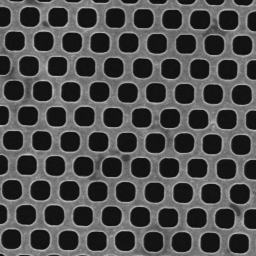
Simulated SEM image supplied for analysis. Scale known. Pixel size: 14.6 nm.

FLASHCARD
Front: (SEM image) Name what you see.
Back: a regular array of holes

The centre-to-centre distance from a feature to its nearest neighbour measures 0.411 micrometres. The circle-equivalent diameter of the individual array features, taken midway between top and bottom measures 306 nm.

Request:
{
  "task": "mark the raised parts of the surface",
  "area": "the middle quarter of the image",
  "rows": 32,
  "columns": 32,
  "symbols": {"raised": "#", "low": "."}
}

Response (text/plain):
.##.....##.....##.....##.....##.
.##.....##.....##.....##.....##.
###....###.....##.....##.....###
############.######..####...####
#.######..######################
....###....###....###....###....
....##......#......#.....###....
....##.....##......#......##....
....###....###....###....###....
#..#####.#####...#####..####....
################################
###....###....####...####...####
###.....##.....##.....##.....##.
.#......##.....##.....##.....##.
###....###.....##.....##.....##.
####...###....####...####...###.
################################
...####....###...####...#####..#
....##.....##.....##.....###....
....##.....##.....##.....##.....
....##.....##.....##.....##.....
...####....###....###....###....
################################
###...#####..######.#####..#####
###....###....###....###.....##.
##......#......##.....##.....##.
##.....##......##.....##.....##.
###....###....###....###....###.
################################
...####..######.################
....##.....##.....##.....###....
....##.....##.....##.....##.....